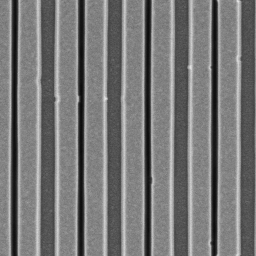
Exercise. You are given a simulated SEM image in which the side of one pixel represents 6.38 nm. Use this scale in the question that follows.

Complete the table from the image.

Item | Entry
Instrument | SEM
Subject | parallel lines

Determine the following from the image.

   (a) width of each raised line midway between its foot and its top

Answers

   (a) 142 nm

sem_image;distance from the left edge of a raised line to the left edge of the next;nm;213